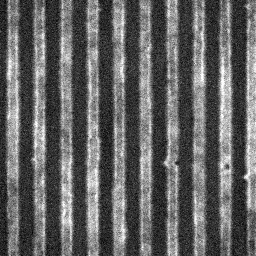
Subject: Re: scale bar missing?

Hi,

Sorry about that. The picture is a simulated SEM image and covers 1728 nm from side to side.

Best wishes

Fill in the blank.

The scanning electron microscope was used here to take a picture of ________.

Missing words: parallel lines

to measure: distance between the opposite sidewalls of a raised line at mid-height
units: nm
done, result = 73.4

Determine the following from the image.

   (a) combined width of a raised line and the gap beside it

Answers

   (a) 0.179 micrometres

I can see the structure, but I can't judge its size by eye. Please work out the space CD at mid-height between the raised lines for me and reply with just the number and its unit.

0.104 µm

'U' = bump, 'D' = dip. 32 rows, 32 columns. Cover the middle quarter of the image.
UUDDDDUUUDDDDUUDDDDUUUDDDDUUDDDD
UUDDDDUUUDDDDUUDDDDUUUDDDDUUDDDD
UUDDDDUUUDDDDUUDDDDUUUDDDDUUDDDD
UUDDDDUUUDDDDUUDDDDUUUDDDDUUDDDD
UUDDDDUUUDDDDUUDDDDUUUDDDDUUDDDD
UUDDDDUUUDDDDUUDDDDUUUDDDDUUDDDD
UUDDDDUUUDDDDUUDDDDUUUDDDDUUDDDD
UUDDDDUUUDDDDUUDDDDUUUDDDDUUDDDD
UUDDDDUUUDDDDUUDDDDUUUDDDDUUDDDD
UUDDDDUUUDDDDUUDDDDUUUDDDDUUDDDD
UUDDDDUUUDDDDUUDDDDUUUDDDDUUDDDD
UUDDDDUUUDDDDUUDDDDUUUDDDDUUDDDD
UUDDDDUUUDDDDUUDDDDUUUDDDDUUDDDD
UUDDDDUUUDDDDUUDDDDUUUDDDDUUDDDD
UUDDDDUUUDDDDUUDDDDUUUDDDDUUDDDD
UUDDDDUUUDDDDUUDDDDUUUDDDDUUDDDD
UUDDDDUUUDDDDUUDDDDUUUDDDDUUDDDD
UUDDDDUUUDDDDUUDDDDUUUDDDDUUDDDD
UUDDDDUUUDDDDUUDDDDUUUDDDDUUDDDD
UUDDDDUUUDDDDUUDDDDUUUDDDDUUDDDD
UUDDDDUUUDDDDUUDDDDUUUDDDDUUDDDD
UUDDDDUUUDDDDUUDDDDUUUDDDDUUDDDD
UUDDDDUUUDDDDUUDDDDUUUDDDDUUDDDD
UUDDDDUUUDDDDUUDDDDUUUDDDDUUDDDD
UUDDDDUUUDDDDUUDDDDUUUDDDUUUDDDD
UUDDDDUUUDDDDUUDDDDUUUDDDUUUDDDD
UUDDDDUUUDDDDUUDDDDUUUDDDDUUDDDD
UUDDDDUUUDDDDUUDDDDUUUDDDDUUDDDD
UUDDDDUUUDDDDUUDDDDUUUDDDDUUDDDD
UUDDDDUUUDDDDUUDDDDUUUDDDDUUDDDD
UUDDDDUUUDDDDUUDDDDUUUDDDDUUDDDD
UUDDDDUUUDDDDUUDDDDUUUDDDDUUDDDD